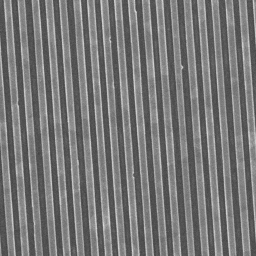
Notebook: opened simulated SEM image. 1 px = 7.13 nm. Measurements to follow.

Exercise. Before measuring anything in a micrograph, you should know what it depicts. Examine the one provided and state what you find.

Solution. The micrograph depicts parallel lines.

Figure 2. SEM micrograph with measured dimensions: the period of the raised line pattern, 98.4 nanometres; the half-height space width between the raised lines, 50.7 nm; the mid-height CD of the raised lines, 50.7 nanometres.